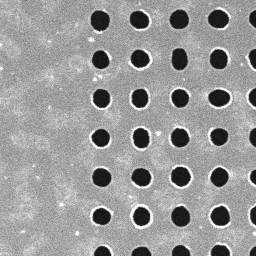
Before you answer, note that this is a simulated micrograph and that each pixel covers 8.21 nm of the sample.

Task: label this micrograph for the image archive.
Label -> a regular array of holes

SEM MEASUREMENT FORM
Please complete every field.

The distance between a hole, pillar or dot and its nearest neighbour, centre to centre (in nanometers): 319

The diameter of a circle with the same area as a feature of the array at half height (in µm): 0.155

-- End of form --